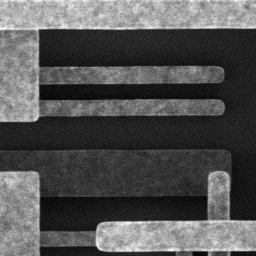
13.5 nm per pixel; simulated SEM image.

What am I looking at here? wiring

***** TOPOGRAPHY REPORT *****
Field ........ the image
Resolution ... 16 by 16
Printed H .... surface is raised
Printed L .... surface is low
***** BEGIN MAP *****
HHHHHHHHHHHHHHHH
HHHHHHHHHHHHHHHH
HHLLLLLLLLLLLLLL
HHLLLLLLLLLLLLLL
HHLLLLLLLLLLLLLL
HHLLLLLLLLLLLLLL
HHLLLLLLLLLLLLLL
HHLLLLLLLLLLLLLL
LLLLLLLLLLLLLLLL
LLLLLLLLLLLLLLLL
LLLLLLLLLLLLLLLL
HHLLLLLLLLLLLHLL
HHLLLLLLLLLLLHLL
HHLLLLLLLLLLLHLL
HHLLLLHHHHHHHHHH
HHLLLLHHHHHHHHHH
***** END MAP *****